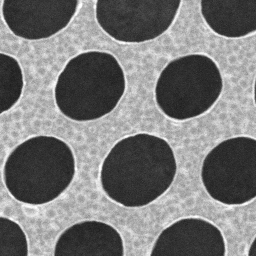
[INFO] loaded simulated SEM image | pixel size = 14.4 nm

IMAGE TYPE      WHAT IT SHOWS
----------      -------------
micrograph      holes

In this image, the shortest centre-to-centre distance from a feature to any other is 1.4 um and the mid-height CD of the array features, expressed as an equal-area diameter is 1010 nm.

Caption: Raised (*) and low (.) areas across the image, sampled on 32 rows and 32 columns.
..........**...........**.......
.........***..........***.......
*........***..........****......
*.......*****........*****......
**....********......********..**
********************************
***********..*******************
..*******.....********....******
...*****.......******......*****
...****........*****........****
...****.........****........****
...****.........***.........****
..*****........****........*****
.******.......******......******
********.....********...********
********************************
********************************
***....********.....********....
**.......*****.......******.....
*........****.........****......
*........****.........***.......
.........****.........***.......
.........****.........***.......
*.......*****........*****......
**.....*******......******......
****.**********...**********..**
********************************
.**********************...******
...*****......*******......*****
...****........*****........****
...****........****.........***.
...****........****.........***.